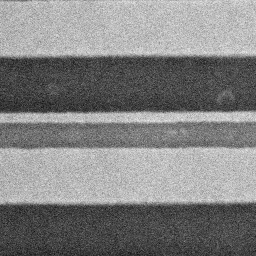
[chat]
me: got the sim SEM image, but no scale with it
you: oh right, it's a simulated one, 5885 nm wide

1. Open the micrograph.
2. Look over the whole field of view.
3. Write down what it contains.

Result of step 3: lines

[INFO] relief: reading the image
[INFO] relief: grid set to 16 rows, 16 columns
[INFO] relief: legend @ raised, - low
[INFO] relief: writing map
@@@@@@@@@@@@@@@@
@@@@@@@@@@@@@@@@
@@@@@@@@@@@@@@@@
----------------
----------------
----------------
----------------
@@@@@@@@@@@@@@@@
@@@@@@@@@@@@@@@@
@@@@@@@@@@@@@@@@
@@@@@@@@@@@@@@@@
@@@@@@@@@@@@@@@@
@@@@@@@@@@@@@@@@
----------------
----------------
----------------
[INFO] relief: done